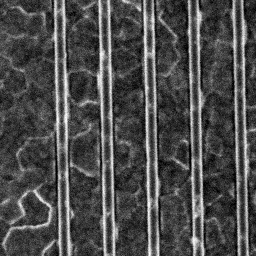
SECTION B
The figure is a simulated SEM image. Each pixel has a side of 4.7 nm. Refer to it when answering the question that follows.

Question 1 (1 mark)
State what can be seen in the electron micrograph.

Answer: parallel lines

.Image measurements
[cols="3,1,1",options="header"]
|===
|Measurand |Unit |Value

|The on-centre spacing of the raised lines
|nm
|209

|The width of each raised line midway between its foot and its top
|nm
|48.2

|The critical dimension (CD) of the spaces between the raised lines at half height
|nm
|162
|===